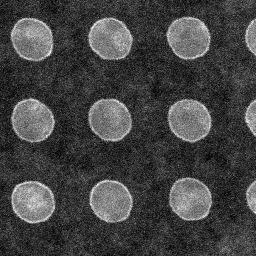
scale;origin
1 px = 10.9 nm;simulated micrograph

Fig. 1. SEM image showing a regular array of raised bodies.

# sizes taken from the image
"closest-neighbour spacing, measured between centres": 855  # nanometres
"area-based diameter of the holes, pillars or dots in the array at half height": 454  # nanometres